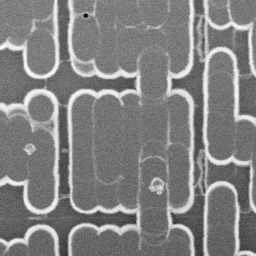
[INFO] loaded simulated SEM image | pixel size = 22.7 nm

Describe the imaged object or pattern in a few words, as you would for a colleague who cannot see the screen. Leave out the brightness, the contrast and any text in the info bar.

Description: wiring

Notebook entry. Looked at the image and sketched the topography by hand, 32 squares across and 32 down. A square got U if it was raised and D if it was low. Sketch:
UUUUUUUDDUUUUUUUUUUUUUUUDDUUUUUU
UUUUUUUDDUUUUUUUUUUUUUUUDDUUUUUU
UUUUUUUDDUUUUUUUUUUUUUUUDDUUUUUU
UUUUUUUDDUUUUUUUUUUUUUUUDDDDDDDU
UUUUUUUDDUUUUUUUUUUUUUUUDDDDDDDU
UUUUUUUDDUUUUUUUUUUUUUUUDDDDDDDU
DDDUUUUDDUUUUUUUUUUUUUUUDDDUUDDU
DDDUUUUDDUUUUUUUUUUUUUUUDDUUUDDU
DDDUUUUDDUUUUUUUUUUUUUUUDDUUUDDU
DDDDUUDDDDDDDDDDDUUUUUDDDDUUUDDD
DDDDDDDDDDDDDDDDDUUUUDDDDDUUUDDD
DDDDDUDDDDDDDDDDDUUUUUUDDDUUUUDD
DDDUUUUDDUUUUUUUUUUUUUUUDDUUUUDD
UUUUUUUDDUUUUUUUUUUUUUUUDDUUUUDD
UUUUUUUDDUUUUUUUUUUUUUUUDDUUUUDD
UUUUUUUDDUUUUUUUUUUUUUUUDDUUUUUU
UUUUUUUDDUUUUUUUUUUUUUUUDDUUUUUU
UUUUUUUDDUUUUUUUUUUUUUUUDDUUUUUU
UUUUUUUDDUUUUUUUUUUUUUUUDDUUUUUU
UUUUUUUDDUUUUUUUUUUUUUUUDDUUUUUU
UUUUUUUDDUUUUUUUUUUUUUUUDDDDDDDU
UUUUUUUDDUUUUUUUUUUUUUUUDDDDDDDU
UUUUUUUDDUUUUUUUUUUUUUUUDDDDDDDU
DDDUUUUDDUUUUUUUUUUUUUUUDDUUUDDU
DDDUUUUDDUUUUUUUUUUUUUUUDDUUUUDU
DDDUUUUDDUUUUUUUUUUUUUUUDDUUUUDU
DDDDDDDDDDDDDDDDDUUUUDDDDDUUUUDD
DDDDDDDDDDDDDDDDDUUUUDDDDDUUUUDD
DDDDUUDDDDUUDUDDUUUUUUUDDDUUUUDD
DDDUUUUDDUUUUUUUUUUUUUUUDDUUUUDD
UUUUUUUDDUUUUUUUUUUUUUUUDDUUUUDD
UUUUUUUDDUUUUUUUUUUUUUUUDDUUUUDD